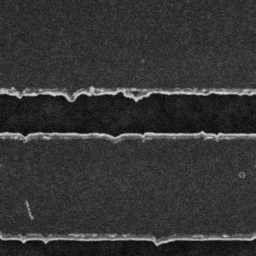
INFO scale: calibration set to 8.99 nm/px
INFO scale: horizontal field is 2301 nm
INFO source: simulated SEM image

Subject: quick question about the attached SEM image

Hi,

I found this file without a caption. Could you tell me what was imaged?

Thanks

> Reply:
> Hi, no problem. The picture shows one or a few lines or trenches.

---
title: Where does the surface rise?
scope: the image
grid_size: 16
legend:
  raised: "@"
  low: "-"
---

@@@@@@@@@@@@@@@@
@@@@@@@@@@@@@@@@
@@@@@@@@@@@@@@@@
@@@@@@@@@@@@@@@@
@@@@@@@@@@@@@@@@
@@@@@@@@@@@@@@@@
----------------
----------------
@@@@@@@-@@@@@@@@
@@@@@@@@@@@@@@@@
@@@@@@@@@@@@@@@@
@@@@@@@@@@@@@@@@
@@@@@@@@@@@@@@@@
@@@@@@@@@@@@@@@@
@@@@@@@@@@@@@@@@
----------------